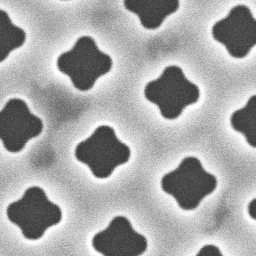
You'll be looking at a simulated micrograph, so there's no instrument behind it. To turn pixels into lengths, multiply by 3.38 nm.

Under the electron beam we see holes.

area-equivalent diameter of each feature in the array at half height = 167 nanometres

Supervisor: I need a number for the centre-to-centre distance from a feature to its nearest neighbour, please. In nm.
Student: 308